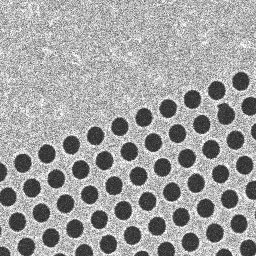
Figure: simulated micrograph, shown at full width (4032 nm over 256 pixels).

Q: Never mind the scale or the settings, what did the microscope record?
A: a regular array of holes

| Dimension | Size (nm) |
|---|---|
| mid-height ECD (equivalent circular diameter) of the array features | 297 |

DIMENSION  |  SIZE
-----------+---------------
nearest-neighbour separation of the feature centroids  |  405 nanometres